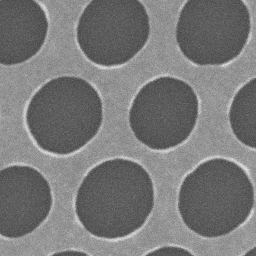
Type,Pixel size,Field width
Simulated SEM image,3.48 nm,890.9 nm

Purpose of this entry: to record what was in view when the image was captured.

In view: holes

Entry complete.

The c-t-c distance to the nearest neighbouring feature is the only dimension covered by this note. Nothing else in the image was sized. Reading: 342 nanometers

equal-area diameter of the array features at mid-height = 269 nm